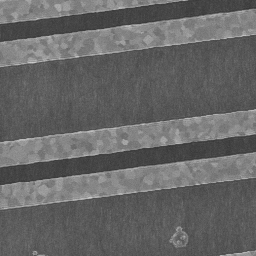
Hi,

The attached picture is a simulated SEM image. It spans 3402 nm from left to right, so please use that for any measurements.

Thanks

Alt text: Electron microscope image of lines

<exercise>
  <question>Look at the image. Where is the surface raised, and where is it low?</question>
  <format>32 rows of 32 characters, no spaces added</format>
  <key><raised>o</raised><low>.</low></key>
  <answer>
oooooooooooooooooooo............
oooooooooooo.................ooo
ooo..................ooooooooooo
..............oooooooooooooooooo
......oooooooooooooooooooooooo..
ooooooooooooooooooooooo.........
ooooooooooooooo.................
oooooo..........................
................................
................................
................................
................................
................................
................................
..........................oooooo
..................oooooooooooooo
..........oooooooooooooooooooooo
..oooooooooooooooooooooooo......
oooooooooooooooooo..............
ooooooooooo..................ooo
ooo..................ooooooooooo
.............ooooooooooooooooooo
.....oooooooooooooooooooooooo...
ooooooooooooooooooooo...........
oooooooooooooo..................
ooooo...........................
................................
................................
................................
................................
................................
...............................o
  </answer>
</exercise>